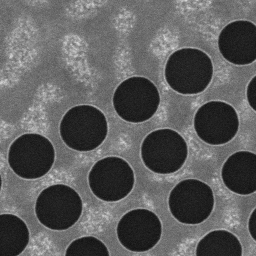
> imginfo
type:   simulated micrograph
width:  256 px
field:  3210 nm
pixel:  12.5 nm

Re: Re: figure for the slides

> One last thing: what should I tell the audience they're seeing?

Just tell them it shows a regular array of holes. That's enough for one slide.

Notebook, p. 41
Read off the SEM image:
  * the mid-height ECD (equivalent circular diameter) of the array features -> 584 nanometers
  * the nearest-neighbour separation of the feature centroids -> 728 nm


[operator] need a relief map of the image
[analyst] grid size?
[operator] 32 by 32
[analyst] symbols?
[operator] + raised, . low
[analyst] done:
++++++++++++++++++++++++++++++++
++++++++++++++++++++++++++++++++
++++++++++++++++++++++++++++++++
++++++++++++++++++++++++++++....
+++++++++++++++++++++++++++.....
+++++++++++++++++++++++++++.....
++++++++++++++++++++++...++.....
+++++++++++++++++++++.....++....
+++++++++++++++++++++......+++++
+++++++++++++++++++++......+++++
+++++++++++++++....++.....+++++.
++++++++++++++......++...++++++.
++++++++++++++......+++++++++++.
+++++++++...++......+++++....+++
++++++++.....++....+++++......++
+++++++......+++++++++++......++
++++++++.....++++++...++......++
++....++.....+++++.....++....+++
+......++...++++++.....+++++++++
+......+++++++++++.....++++++...
+......+++++....++.....+++++....
++....+++++......++...++++++....
+++++++++++......++++++..+++....
++++++...++......+++++....++....
+++++.....++....+++++......+++++
++++......+++++++++++......+++++
++++......++++++...++.....++++++
...++.....+++++.....++....+++++.
...+++...++++++.....+++++++++++.
....+++++++++++.....++++++...++.
....+++++....++.....+++++.....++
...+++++......+++.++++++......++